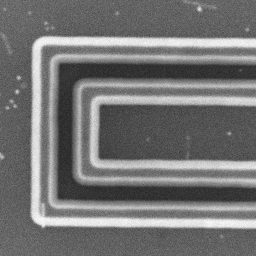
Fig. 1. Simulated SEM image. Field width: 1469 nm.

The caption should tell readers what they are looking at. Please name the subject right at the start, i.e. groups of lines, slits or small figures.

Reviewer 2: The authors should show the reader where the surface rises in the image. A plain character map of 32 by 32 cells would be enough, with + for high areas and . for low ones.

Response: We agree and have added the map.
................................
................................
................................
................................
................................
.....+++++++++++++++++++++++++++
.....+++++++++++++++++++++++++++
.....++................+++.+++++
.....++.........................
.....++.........................
.....++...++++++++++++++++++++++
.....++...++++++++++++++++++++++
.....++...++++++++++++++++++++++
.....++...++....................
.....++...++....................
....+++...++....................
....+++...++....................
....+++...++....................
....+++...++....................
....+++...++....................
....+++...+++++++++++...........
....+++...++++++++++++++++++++++
....+++...++++++++++++++++++++++
....+++.........................
....+++.........................
....++++++......................
....++++++++++++++++++++++++++++
.....+++++++++++++++++++++++++++
................................
................................
................................
................................